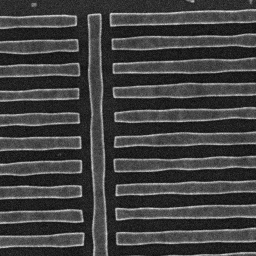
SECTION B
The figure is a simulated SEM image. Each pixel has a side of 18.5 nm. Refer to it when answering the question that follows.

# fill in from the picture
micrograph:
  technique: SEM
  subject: groups of lines, slits or small figures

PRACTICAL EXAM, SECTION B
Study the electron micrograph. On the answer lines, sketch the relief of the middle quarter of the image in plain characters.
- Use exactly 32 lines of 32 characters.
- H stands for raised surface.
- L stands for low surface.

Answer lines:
HHHHLLHHHLLLHHHHHHHHHHHHHHHHHHHH
HHHHLLHHHLLLHHHHHHHHHHHHHHHHHHHH
HHHHLLHHHLLLLLLLLLLLLLLLLLLLLLLL
LLLLLLHHHLLLLLLLLLLLLLLLLLLLLLLL
LLLLLLHHHHLLLLLLLLLLLLLLLLLLLLLL
LLLLLLHHHHLLLLLLLLLLLLHHHHHHHHHH
HHHHLLHHHHLLHHHHHHHHHHHHHHHHHHHH
HHHHLLLHHHLLHHHHHHHHHHHHHHHHHHHH
HHHHLLLHHHLLLLLLLLLLLLLLLLLLLLLL
LLLLLLLHHLLLLLLLLLLLLLLLLLLLLLLL
LLLLLLLHHLLLLLLLLLLLLLLLLLLLLLLL
LLLLLLLHHLLLLLLLLLLLLLLLLLHHHHHH
HHHHLLLHHLLLLHHHHHHHHHHHHHHHHHHH
HHHHLLLHHHLLLHHHHHHHHHHHHHHHHHHH
HHHHLLLHHHLLLLLHHHHLLLLLLLLLLLLL
LLLLLLLHHHLLLLLLLLLLLLLLLLLLLLLL
LLLLLLLHHHLLLLLLLLLLLLLLLLLLLLLL
LLLLLLLHHHLLLLLLLLLLLLLLLLHHHHHH
HHHHLLLHHHLLLHHHHHHHHHHHHHHHHHHH
HHHHLLLHHHLLLHHHHHHHHHHHHHHHHHHH
HHHHLLLHHHLLLHHHHLLLLLHHHLLLLLLL
LLLLLLLHHHLLLLLLLLLLLLLLLLLLLLLL
LLLLLLLHHHLLLLLLLLLLLLLLLLLLLLLL
LLLLLLLHHHLLLLLLLLLLLLLLLLLLLLLL
HHHHLLLHHHLLLHHHHHHHHHHHHHHHHHHH
HHHHLLLHHHLLLHHHHHHHHHHHHHHHHHHH
HHHHLLLHHHLLLHHHHHHHHHHHHLLLLLLL
LLLLLLLHHHLLLLLLLLLLLLLLLLLLLLLL
LLLLLLLHHHLLLLLLLLLLLLLLLLLLLLLL
LLLLLLLHHHLLLLLLLLLLLLLLLLLLLLLL
LHLLLLLHHHLLLHHHHHHHHHHHHHHHHHHH
HHHHLLLHHHLLLHHHHHHHHHHHHHHHHHHH